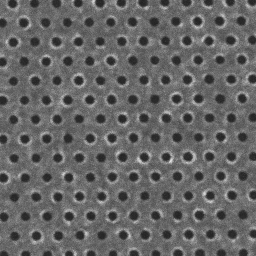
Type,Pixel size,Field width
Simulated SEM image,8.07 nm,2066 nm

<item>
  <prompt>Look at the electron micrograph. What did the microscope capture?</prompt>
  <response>a regular array of holes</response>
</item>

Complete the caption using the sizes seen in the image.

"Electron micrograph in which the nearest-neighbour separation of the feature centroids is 175 nm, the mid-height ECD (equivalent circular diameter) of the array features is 80.5 nanometers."